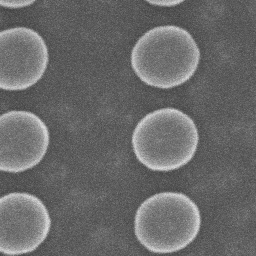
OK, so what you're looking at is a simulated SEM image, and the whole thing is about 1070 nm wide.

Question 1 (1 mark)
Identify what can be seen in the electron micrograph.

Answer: raised bodies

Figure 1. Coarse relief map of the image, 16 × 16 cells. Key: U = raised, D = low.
DDDDDDDDDDDDDDDD
DDDDDDDDDDDDDDDD
UUUDDDDDDUUUDDDD
UUUDDDDDUUUUDDDD
UUUDDDDDDUUUDDDD
UDDDDDDDDDDDDDDD
DDDDDDDDDDDDDDDD
UUDDDDDDDUUUDDDD
UUUDDDDDUUUUDDDD
UUUDDDDDUUUUDDDD
UUDDDDDDDUUDDDDD
DDDDDDDDDDDDDDDD
UUDDDDDDDUUUDDDD
UUUDDDDDDUUUDDDD
UUUDDDDDDUUUDDDD
UUDDDDDDDUUDDDDD